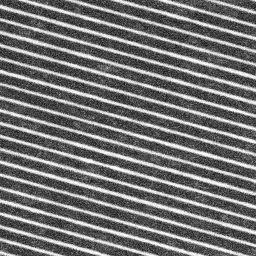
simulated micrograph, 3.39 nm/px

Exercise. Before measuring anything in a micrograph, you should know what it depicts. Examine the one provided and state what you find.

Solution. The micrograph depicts parallel lines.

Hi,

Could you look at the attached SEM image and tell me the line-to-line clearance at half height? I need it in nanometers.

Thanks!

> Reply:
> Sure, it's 33.5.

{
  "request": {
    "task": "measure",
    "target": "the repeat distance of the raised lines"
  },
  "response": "0.0423 micrometres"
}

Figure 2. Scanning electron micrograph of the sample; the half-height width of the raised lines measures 7 nanometers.